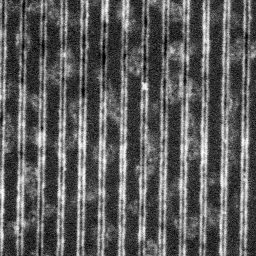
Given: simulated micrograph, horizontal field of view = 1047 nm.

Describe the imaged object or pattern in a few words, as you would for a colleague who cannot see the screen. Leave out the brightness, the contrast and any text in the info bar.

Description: parallel lines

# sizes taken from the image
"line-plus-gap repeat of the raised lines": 0.083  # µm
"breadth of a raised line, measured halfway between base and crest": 0.0199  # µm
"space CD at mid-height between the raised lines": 15.6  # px